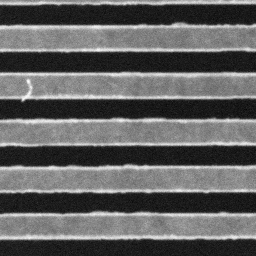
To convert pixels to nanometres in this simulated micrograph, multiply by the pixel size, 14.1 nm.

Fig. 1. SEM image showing lines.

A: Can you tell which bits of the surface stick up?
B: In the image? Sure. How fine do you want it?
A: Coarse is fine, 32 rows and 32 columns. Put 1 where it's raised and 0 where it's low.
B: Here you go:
11111000000110110001000000000000
00000000000000000000000000000000
00000000000000000000000000000000
11111111111111111111111111111111
11111111111111111111111111111111
11111111111111111111111111111111
00000000000000000000000000000000
00000000000000000000000000000000
00000000000000000000000000000000
11111111111111111111111111111111
11111111111111111111111111111111
11111111111111111111111111111111
00000000000000000000000000000000
00000000000000000000000000000000
00000000000000000000000000000000
11111111111111111111111111111111
11111111111111111111111111111111
11111111111111111111111111111111
00000000000000000000000000000000
00000000000000000000000000000000
00000000000000000000000000000000
11111111111111111111111111111111
11111111111111111111111111111111
11111111111111111111111111111111
00000000000000000000000000000000
00000000000000000000000000000000
00000000000000000000000000000000
11111111111111111111111111111111
11111111111111111111111111111111
11111111111111111111111111111111
00000000000000000000000000000000
00000000000000000000000000000000